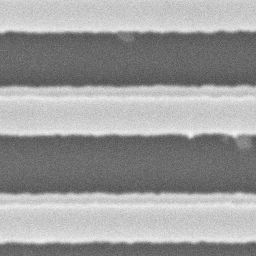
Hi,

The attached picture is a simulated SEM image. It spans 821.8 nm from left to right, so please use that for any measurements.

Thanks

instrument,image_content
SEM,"lines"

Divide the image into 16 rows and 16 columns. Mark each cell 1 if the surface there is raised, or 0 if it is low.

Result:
1111111111111111
1111111111111111
0000000000000000
0000000000000000
0000000000000000
1101111011111111
1111111111111111
1111111111111111
0000000000000000
0000000000000000
0000000000000000
0000000000000000
1111111111111111
1111111111111111
1111111111111111
0000000000000000